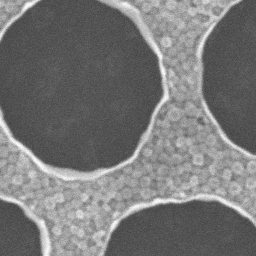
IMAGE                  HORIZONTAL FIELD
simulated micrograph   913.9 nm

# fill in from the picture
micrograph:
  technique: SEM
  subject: holes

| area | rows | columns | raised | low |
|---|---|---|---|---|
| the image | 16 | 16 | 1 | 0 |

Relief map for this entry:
1100000011111100
1000000001111100
0000000001111000
0000000000111000
0000000000111000
0000000000111000
0000000000111000
0000000001111000
1000000001111100
1100000011111111
1110000111111111
1111111111111111
1111111111110111
0011111100000001
0001111000000000
0001111000000000